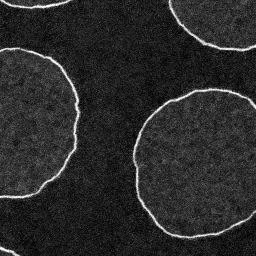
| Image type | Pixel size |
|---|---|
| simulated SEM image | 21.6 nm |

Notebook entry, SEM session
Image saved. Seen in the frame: raised bodies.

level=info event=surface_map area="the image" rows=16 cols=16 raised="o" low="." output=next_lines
...........ooooo
...........ooooo
............oooo
ooo.............
oooo............
ooooo...........
ooooo.....oooooo
ooooo....ooooooo
ooooo....ooooooo
ooooo...oooooooo
oooo.....ooooooo
ooo......ooooooo
.........ooooooo
.........ooooooo
..........oooo..
................